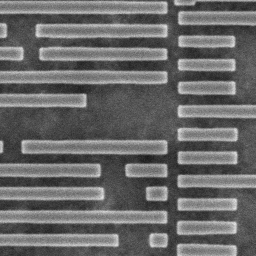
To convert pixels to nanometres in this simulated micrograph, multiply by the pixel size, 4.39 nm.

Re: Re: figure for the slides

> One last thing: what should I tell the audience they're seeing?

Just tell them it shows wiring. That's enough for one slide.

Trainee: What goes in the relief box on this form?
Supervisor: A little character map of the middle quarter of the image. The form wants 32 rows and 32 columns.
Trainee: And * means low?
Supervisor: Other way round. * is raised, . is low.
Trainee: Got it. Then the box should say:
.............................***
................................
**************************......
**************************......
**************************......
.............................***
.............................***
................................
*****...........................
*****...........................
....*...........................
.............................***
.............................***
................................
................................
................................
.............................***
.............................***
.............................***
**************************......
**************************......
**************************......
.............................***
.............................***
.............................***
*********......***********......
*********......***********......
*********.......**********......
.............................***
.............................***
.............................***
**********...........*****......